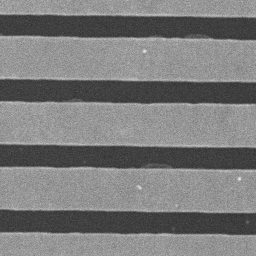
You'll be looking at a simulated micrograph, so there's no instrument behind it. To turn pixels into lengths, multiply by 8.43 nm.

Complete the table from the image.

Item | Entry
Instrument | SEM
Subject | lines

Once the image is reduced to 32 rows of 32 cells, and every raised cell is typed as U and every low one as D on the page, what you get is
UUUUUUUUUUUUUUUUUUUUUUUUUUUUUUUU
UUUUUUUUUUUUUUUUUUUUUUUUUUUUUUUU
DDDDDDDDDDDDDDDDDDDDDDDDDDDDDDDD
DDDDDDDDDDDDDDDDDDDDDDDDDDDDDDDD
DDDDDDDDDDDDDDDDDDDDDDDDDDDDDDDD
UUUUUUUUUUUUUUUUUUUUUUUUUUUUUUUU
UUUUUUUUUUUUUUUUUUUUUUUUUUUUUUUU
UUUUUUUUUUUUUUUUUUUUUUUUUUUUUUUU
UUUUUUUUUUUUUUUUUUUUUUUUUUUUUUUU
UUUUUUUUUUUUUUUUUUUUUUUUUUUUUUUU
DDDDDDDDDDDDDDDDDDDDDDDDDDDDDDDD
DDDDDDDDDDDDDDDDDDDDDDDDDDDDDDDD
DDDDDDDDDDDDDDDDDDDDDDDDDDDDDDDD
UUUUUUUUUUUUUUUUUUUUUUUUUUUUUUUU
UUUUUUUUUUUUUUUUUUUUUUUUUUUUUUUU
UUUUUUUUUUUUUUUUUUUUUUUUUUUUUUUU
UUUUUUUUUUUUUUUUUUUUUUUUUUUUUUUU
UUUUUUUUUUUUUUUUUUUUUUUUUUUUUUUU
DDDDDDDDDDDDDDDDDDDDDDDDDDDDDDDD
DDDDDDDDDDDDDDDDDDDDDDDDDDDDDDDD
DDDDDDDDDDDDDDDDDDDDDDDDDDDDDDDD
UUUUUUUUUUUUUUUUUUUUUUUUUUUUUUUU
UUUUUUUUUUUUUUUUUUUUUUUUUUUUUUUU
UUUUUUUUUUUUUUUUUUUUUUUUUUUUUUUU
UUUUUUUUUUUUUUUUUUUUUUUUUUUUUUUU
UUUUUUUUUUUUUUUUUUUUUUUUUUUUUUUU
DDDDDDDDDDDDDDDDDDDDDDDDDUUUUUUU
DDDDDDDDDDDDDDDDDDDDDDDDDDDDDDDD
DDDDDDDDDDDDDDDDDDDDDDDDDDDDDDDD
UUUUUUUUUUUUUUUUUUUUUUUUUUUUUUUU
UUUUUUUUUUUUUUUUUUUUUUUUUUUUUUUU
UUUUUUUUUUUUUUUUUUUUUUUUUUUUUUUU